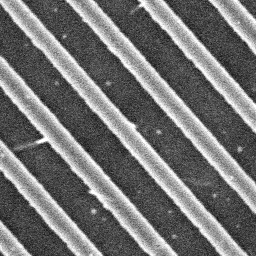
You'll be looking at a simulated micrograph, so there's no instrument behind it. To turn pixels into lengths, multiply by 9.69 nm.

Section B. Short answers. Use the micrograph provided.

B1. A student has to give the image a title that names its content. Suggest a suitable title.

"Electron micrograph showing lines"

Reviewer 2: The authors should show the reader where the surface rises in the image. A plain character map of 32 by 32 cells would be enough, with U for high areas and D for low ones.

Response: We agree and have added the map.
UUUDDDDDDUUUDDDDDDUUUDDDDDDUUUDD
DUUUDDDDDDUUUDDDDDDUUUDDDDDUUUUD
DDUUUDDDDDDUUUDDDDDUUUUDDDDDUUUU
DDDUUUDDDDDUUUUDDDDDUUUDDDDDDUUU
DDDDUUUDDDDDUUUUDDDDDUUUDDDDDDUU
DDDDUUUDDDDDDUUUDDDDDDUUUDDDDDDU
DDDDDUUUDDDDDDUUUDDDDDDUUUDDDDDD
DDDDDDUUUDDDDDDUUUDDDDDDUUUDDDDD
UDDDDDDUUUDDDDDDUUUDDDDDDUUUDDDD
UUDDDDDDUUUDDDDDDUUUDDDDDDUUUDDD
UUUDDDDDDUUUDDDDDDUUUDDDDDDUUUDD
DUUUDDDDDDUUUDDDDDDUUUDDDDDUUUDD
DDUUUDDDDDDUUUDDDDDUUUUDDDDDUUUD
DDUUUUDDDDDUUUDDDDDDUUUDDDDDDUUU
DDDUUUUDDDDDUUUDDDDDDUUUDDDDDDUU
DDDDUUUDDDDDDUUUDDDDDDUUUDDDDDDU
DDDDDUUUDDDDDDUUUDDDDDDUUUDDDDDD
DDDDDDUUUDDDDDDUUUDDDDDDUUUDDDDD
UDDDDDDUUUDDDDDDUUUDDDDDDUUUDDDD
UUDDDDDDUUUDDDDDDUUUDDDDDDUUUDDD
UUUDDDDDDUUUDDDDDDUUUDDDDDUUUUDD
UUUDDDDDDUUUUDDDDDDUUUDDDDDUUUDD
DUUUDDDDDDUUUUDDDDDUUUDDDDDDUUUD
DDUUUDDDDDDUUUUDDDDDUUUDDDDDDUUU
DDDUUUDDDDDDUUUUDDDDDUUUDDDDDDUU
DDDDUUUDDDDDDUUUDDDDDDUUUDDDDDDU
DDDDDUUUDDDDDDUUUDDDDDDUUUDDDDDD
DDDDDDUUUDDDDDDUUUDDDDDDUUUDDDDD
UDDDDDUUUUDDDDDDUUUDDDDDDUUUDDDD
UUDDDDDUUUUDDDDDDUUUDDDDDDUUUDDD
UUDDDDDDUUUDDDDDDUUUUDDDDDDUUDDD
UUUDDDDDDUUUDDDDDDUUUUDDDDDUUUDD